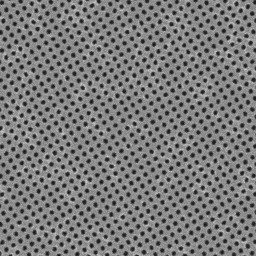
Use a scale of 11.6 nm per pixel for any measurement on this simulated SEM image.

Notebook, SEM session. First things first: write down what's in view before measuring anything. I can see a regular array of holes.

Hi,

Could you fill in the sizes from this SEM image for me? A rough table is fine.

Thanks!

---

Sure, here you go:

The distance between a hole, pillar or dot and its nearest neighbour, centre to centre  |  0.0921 um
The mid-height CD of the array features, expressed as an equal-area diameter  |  55.4 nm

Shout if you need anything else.